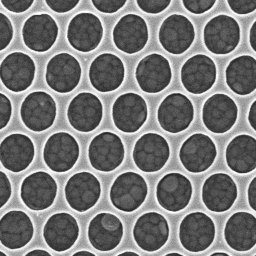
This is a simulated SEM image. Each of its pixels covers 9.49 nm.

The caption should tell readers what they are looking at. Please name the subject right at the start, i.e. a regular array of holes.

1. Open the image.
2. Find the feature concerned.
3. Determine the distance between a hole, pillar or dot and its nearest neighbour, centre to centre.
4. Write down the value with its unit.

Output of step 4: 426 nanometres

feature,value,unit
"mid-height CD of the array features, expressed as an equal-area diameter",357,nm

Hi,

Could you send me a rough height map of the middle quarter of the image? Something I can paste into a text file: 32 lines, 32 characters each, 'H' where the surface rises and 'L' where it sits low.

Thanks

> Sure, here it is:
LLLLHHHLLLLLLLLHHHLLLLLLLLHHHHLL
LLLLHHLLLLLLLLLHHHLLLLLLLLLHHLLL
LLLLHHLLLLLLLLLHHHLLLLLLLLLHHLLL
LLLLHHLLLLLLLLLHHHLLLLLLLLLHHLLL
LLLLHHHLLLLLLLLHHHLLLLLLLLLHHHLL
LLLHHHHLLLLLLLHHHHHLLLLLLLHHHHLL
LLHHHHHHLLLLHHHHHHHLLLLLLHHHHHHL
HHHHLLLHHHHHHHHLLLHHHHHHHHHLLHHH
HHLLLLLLHHHHHLLLLLLLHHHHHLLLLLLH
HHLLLLLLLHHHHLLLLLLLHHHHLLLLLLLL
HLLLLLLLLHHHLLLLLLLLLHHHLLLLLLLL
HLLLLLLLLLHHLLLLLLLLLHHHLLLLLLLL
HLLLLLLLLLHHLLLLLLLLLHHLLLLLLLLL
HLLLLLLLLHHHLLLLLLLLLHHLLLLLLLLL
HLLLLLLLLHHHLLLLLLLLHHHHLLLLLLLL
HHLLLLLLLHHHHLLLLLLHHHHHLLLLLLLH
HHHLLLLHHHHHHHLLLLHHHHHHHLLLLLHH
LHHHHHHHHLLLLHHHHHHHLLLHHHHHHHHH
LLHHHHHLLLLLLLHHHHHLLLLLLHHHHHHL
LLLHHHHLLLLLLLHHHHLLLLLLLLHHHHLL
LLLLHHLLLLLLLLLHHHLLLLLLLLHHHLLL
LLLLHHLLLLLLLLLHHLLLLLLLLLHHHLLL
LLLLHHLLLLLLLLLHHLLLLLLLLLHHHLLL
LLLHHHLLLLLLLLLHHLLLLLLLLLHHHLLL
LLLHHHHLLLLLLLLHHHLLLLLLLLHHHLLL
LLHHHHHLLLLLLLHHHHLLLLLLLHHHHHLL
LHHHHHHHLLLLHHHHHHHLLLLLHHHHHHHL
HHHLLLLHHHHHHHHLLLLHHHHHHHLLLHHH
HLLLLLLLHHHHHLLLLLLLHHHHLLLLLLLH
HLLLLLLLLHHHLLLLLLLLHHHHLLLLLLLL
LLLLLLLLLHHHLLLLLLLLLHHLLLLLLLLL
LLLLLLLLLHHHLLLLLLLLLHHLLLLLLLLL